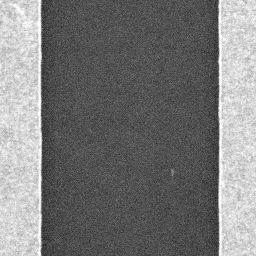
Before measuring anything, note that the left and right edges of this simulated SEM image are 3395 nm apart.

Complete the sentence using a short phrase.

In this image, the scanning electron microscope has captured one or a few lines or trenches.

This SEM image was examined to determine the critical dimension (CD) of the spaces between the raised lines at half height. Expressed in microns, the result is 2.39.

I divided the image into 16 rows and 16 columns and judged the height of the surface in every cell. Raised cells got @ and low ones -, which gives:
@@@-----------@@
@@@-----------@@
@@@-----------@@
@@@-----------@@
@@@-----------@@
@@@-----------@@
@@@-----------@@
@@@-----------@@
@@@-----------@@
@@@-----------@@
@@@-----------@@
@@@-----------@@
@@@-----------@@
@@@-----------@@
@@@-----------@@
@@@-----------@@